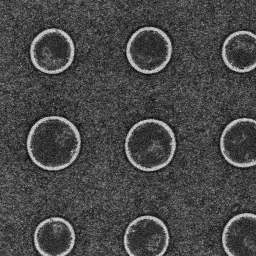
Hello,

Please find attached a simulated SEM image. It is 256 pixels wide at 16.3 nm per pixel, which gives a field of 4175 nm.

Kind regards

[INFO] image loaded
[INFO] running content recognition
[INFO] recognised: raised bodies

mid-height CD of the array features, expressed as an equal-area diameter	0.74	micrometres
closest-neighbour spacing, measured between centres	1530	nm